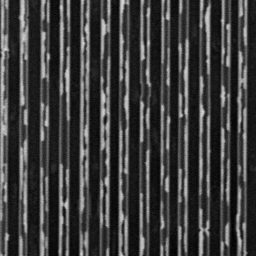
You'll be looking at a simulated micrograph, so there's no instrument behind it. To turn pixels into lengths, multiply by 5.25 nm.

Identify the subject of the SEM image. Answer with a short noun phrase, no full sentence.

parallel lines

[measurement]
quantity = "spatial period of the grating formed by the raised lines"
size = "19.9 px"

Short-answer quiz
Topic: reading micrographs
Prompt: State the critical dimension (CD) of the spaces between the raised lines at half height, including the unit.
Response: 0.0617 um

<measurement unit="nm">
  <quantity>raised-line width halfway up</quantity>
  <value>42.7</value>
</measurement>